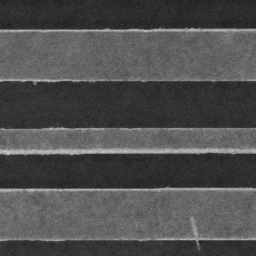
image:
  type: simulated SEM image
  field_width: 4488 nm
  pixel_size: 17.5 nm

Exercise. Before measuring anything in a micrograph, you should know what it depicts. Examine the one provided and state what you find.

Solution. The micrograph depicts lines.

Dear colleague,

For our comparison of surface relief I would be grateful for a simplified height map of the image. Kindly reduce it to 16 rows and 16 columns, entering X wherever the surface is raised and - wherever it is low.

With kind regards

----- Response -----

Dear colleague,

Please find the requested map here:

----------------
----------------
XXXXXXXXXXXXXXXX
XXXXXXXXXXXXXXXX
XXXXXXXXXXXXXXXX
----------------
----------------
----------------
XXXXXXXXXXXXXXXX
XXXXXXXXXXXXXXXX
----------------
----------------
XXXXXXXXXXXXXXXX
XXXXXXXXXXXXXXXX
XXXXXXXXXXXXXXXX
----------------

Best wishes